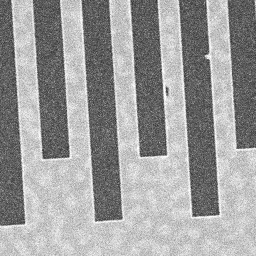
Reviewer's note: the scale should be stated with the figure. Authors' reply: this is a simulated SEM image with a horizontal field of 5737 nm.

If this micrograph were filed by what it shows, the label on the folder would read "parallel lines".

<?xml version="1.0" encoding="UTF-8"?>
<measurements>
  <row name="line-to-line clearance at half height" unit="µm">0.637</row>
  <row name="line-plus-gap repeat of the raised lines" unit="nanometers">1070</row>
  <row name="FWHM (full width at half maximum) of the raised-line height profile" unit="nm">453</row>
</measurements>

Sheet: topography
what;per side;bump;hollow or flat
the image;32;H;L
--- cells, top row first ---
LLHHLLLLHHLLLLHHLLLLHHLLLLHHLLLL
LLHHLLLLHHLLLLHHLLLLHHLLLLHHLLLL
LLHHLLLLHHLLLLHHLLLLHHLLLLHHLLLL
LLHHLLLLHHLLLLHHLLLLHHLLLLHHHLLL
LLHHLLLLHHLLLLHHLLLLHHHLLLHHHLLL
LLHHLLLLHHLLLLHHLLLLHHHLLLHHHLLL
LLHHLLLLHHLLLLHHHLLLHHHLLLHHHLLL
LLHHLLLLHHHLLLHHHLLLHHHLLLHHHLLL
LLHHLLLLHHHLLLHHHLLLHHHLLLHHHLLL
LLHHHLLLHHHLLLHHHLLLHHHLLLHHHLLL
LLHHHLLLHHHLLLHHHLLLLHHLLLLHHLLL
LLHHHLLLHHHLLLHHHLLLLHHLLLLHHLLL
LLHHHLLLHHHLLLLHHLLLLHHLLLLHHLLL
LLHHHLLLHHHLLLLHHLLLLHHLLLLHHLLL
LLHHHLLLLHHLLLLHHLLLLHHLLLLHHLLL
LLLHHLLLLHHLLLLHHLLLLHHLLLLHHLLL
LLLHHLLLLHHLLLLHHLLLLHHLLLLHHLLL
LLLHHLLLLHHLLLLHHLLLLHHLLLLHHLLL
LLLHHLLLLHHLLLLHHLLLLHHLLLLHHHLL
LLLHHLLLLHHLLLLHHHLLLHHLLLLHHHHH
LLLHHHHHHHHLLLLHHHHHHLHHLLLHHHHH
LLLHHHHHHHHLLLLHHHHHHHHHLLLHHHHH
LLLHHLHHHHHLLLLHHHHHHHHHLLLHHHHH
LLLHHHHHHHHHLLLHHHHHHHHHLLLHHHHH
LLLHHHHHHHHHLLLHHHHHHHHHLLLHHHHH
LLLHHHHHHHHHLLLHHHHHHHHHLLLLHHHH
LLLHHHHHHHHHLLLHHHHHHHHHLLLLHHHH
LLLHHHHHHHHHLLLHHHHHHHHHHHHHHHHH
HHHHHHHHHHHHHHHHHHHHHHHHHHHHHHHH
HHHHHHHHHHHHHHHHHHHHHHHHHHHHHHHH
HHHHHHHHHHHHHHHHHHHHHHHHHHHHHHHH
HHHHHHHHHHHHHHHHHHHHHHHHHHHHHHHH